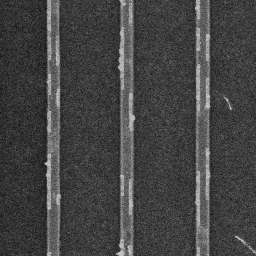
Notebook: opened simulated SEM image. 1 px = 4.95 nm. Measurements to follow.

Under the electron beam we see one or a few lines or trenches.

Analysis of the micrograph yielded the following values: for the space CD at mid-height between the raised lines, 307 nanometers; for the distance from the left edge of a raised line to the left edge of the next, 0.37 um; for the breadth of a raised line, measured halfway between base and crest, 61.9 nm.